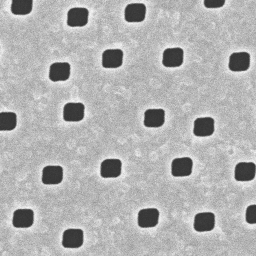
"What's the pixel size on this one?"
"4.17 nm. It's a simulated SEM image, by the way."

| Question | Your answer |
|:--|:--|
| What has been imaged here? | a regular array of holes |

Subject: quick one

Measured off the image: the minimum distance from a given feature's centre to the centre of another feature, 218 nm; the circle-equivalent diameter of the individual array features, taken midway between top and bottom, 91.2 nm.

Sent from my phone